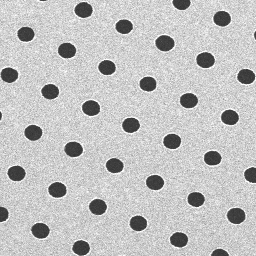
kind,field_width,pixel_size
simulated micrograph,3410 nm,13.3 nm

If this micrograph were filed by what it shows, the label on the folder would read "a regular array of holes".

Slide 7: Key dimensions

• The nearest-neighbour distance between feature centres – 583 nm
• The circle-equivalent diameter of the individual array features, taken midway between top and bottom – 225 nm